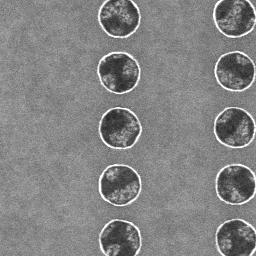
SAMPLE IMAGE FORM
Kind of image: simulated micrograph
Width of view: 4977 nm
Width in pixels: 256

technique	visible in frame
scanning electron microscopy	raised bodies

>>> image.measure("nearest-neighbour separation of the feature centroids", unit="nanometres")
1090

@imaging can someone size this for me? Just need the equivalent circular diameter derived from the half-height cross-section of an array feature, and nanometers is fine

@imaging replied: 804